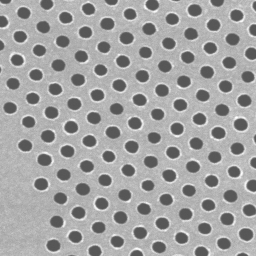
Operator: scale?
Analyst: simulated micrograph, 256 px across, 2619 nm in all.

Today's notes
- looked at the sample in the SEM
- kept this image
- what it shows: a regular array of holes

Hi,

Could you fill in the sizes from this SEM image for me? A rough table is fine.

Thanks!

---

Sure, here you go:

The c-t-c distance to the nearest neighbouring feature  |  240 nm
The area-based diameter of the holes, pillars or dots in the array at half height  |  135 nm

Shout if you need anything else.